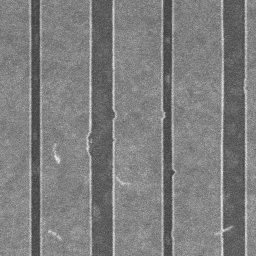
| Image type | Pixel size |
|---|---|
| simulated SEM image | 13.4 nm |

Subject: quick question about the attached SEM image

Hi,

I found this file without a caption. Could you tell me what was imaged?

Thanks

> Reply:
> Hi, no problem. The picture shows one or a few lines or trenches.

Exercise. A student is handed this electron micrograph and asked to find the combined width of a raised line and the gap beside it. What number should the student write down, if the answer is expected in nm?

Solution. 881